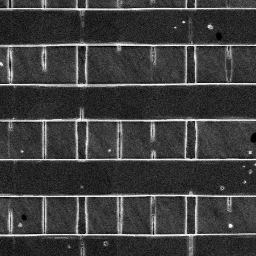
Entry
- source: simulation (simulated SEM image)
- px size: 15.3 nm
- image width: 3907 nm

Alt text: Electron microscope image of wiring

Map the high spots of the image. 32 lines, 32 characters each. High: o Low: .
................................
oooooooooooooooooooooooooooooooo
oooooooooooooooooooooooooooooooo
oooooooooooooo..oooooooooooooooo
ooooooooooooooo.oooooooooooooooo
oooooooooo.....ooooooooooooooooo
................................
................................
................................
................................
................................
oooooooooooooooooooooooooooooooo
oooooooooooooooooooooooooooooooo
oooooooooooooooooooooooooooooooo
oooooooooooooooooooooooooooooooo
................................
................................
................................
................................
................................
oooooooooooooooooooooooooooooooo
oooooooooooooooooooooooooooooooo
oooooooooooooooooooooooooooooooo
oooooooooooooooooooooooooooooooo
ooooooooooooooooo........ooooooo
................................
................................
................................
................................
oooooooooooooooooooooooooooooooo
oooooooooooooooooooooooooooooooo
oooooooooooooooooooooooooooooooo